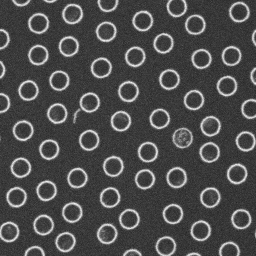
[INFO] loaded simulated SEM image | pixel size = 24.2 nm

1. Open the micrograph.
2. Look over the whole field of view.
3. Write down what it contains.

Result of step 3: a regular array of raised bodies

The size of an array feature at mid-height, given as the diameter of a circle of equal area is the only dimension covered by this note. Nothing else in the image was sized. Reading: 447 nm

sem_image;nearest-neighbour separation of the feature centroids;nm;761